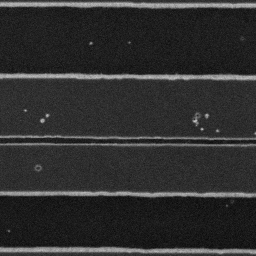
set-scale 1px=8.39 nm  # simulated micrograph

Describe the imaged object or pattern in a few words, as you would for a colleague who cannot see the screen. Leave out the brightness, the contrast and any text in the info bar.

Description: lines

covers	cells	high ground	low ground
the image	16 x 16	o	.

................
................
................
................
................
oooooooooooooooo
oooooooooooooooo
oooooooooooooooo
oooooooooooooooo
oooooooooooooooo
oooooooooooooooo
oooooooooooooooo
................
................
................
................